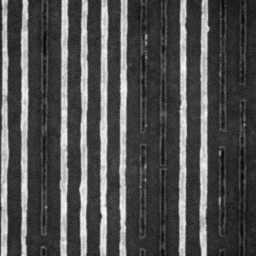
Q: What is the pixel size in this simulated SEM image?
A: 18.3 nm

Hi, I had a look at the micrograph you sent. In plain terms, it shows parallel lines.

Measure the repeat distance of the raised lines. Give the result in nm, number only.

363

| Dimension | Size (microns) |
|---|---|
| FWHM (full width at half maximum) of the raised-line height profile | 0.0917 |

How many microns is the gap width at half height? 0.277